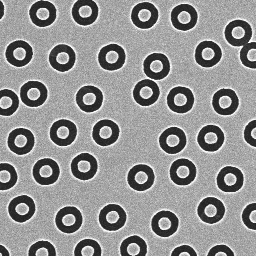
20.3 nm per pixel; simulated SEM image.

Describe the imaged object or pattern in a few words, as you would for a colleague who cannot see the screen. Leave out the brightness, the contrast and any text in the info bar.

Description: a regular array of ring-shaped grooves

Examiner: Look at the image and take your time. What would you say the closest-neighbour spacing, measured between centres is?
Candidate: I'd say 39.2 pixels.